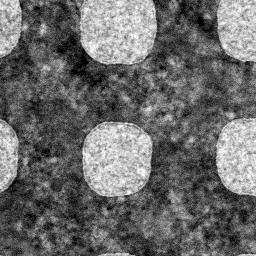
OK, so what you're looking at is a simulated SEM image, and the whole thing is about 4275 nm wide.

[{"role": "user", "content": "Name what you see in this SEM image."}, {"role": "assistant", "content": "raised bodies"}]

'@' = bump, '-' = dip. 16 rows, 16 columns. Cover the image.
@----@@@@@----@@
@----@@@@@----@@
@----@@@@@----@@
------@@@------@
----------------
----------------
----------------
---------------@
@-----@@@-----@@
@----@@@@-----@@
@----@@@@-----@@
@-----@@@-----@@
----------------
----------------
----------------
----------------